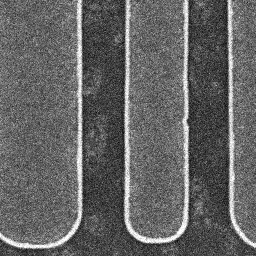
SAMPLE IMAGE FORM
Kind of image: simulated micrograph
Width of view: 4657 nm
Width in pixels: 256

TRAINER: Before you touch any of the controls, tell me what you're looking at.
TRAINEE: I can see one or a few lines or trenches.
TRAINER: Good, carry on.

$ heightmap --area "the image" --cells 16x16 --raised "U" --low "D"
UUUUUDDDUUUUDDUU
UUUUUDDDUUUUDDUU
UUUUUDDDUUUUDDUU
UUUUUDDDUUUUDDUU
UUUUUDDDUUUUDDUU
UUUUUDDDUUUUDDUU
UUUUUDDDUUUUDDUU
UUUUUDDDUUUUDDUU
UUUUUDDDUUUUDDUU
UUUUUDDDUUUUDDDU
UUUUUDDDUUUUDDUU
UUUUUDDDUUUUDDUU
UUUUUDDDUUUUDDUU
UUUUUDDDUUUUDDDU
UUUUUDDDUUUDDDDU
DDDDDDDDDDDDDDDD